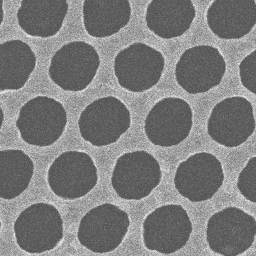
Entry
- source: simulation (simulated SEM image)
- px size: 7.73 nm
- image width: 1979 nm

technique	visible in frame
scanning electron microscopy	a regular array of holes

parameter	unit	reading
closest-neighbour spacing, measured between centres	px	61.5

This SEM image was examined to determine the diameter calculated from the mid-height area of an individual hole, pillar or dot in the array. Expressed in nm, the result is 383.